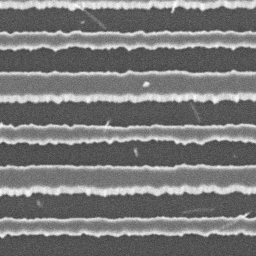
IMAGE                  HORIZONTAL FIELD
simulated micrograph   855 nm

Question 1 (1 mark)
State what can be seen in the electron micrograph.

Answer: lines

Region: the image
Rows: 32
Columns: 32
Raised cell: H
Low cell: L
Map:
HHHHHHHHHHHHHHHHHHHHHHHHHHHHHHHH
LLLLLLLLLLLLLLLLLLLLLLLLLLLLLLLL
LLLLLLLLLLLLLLLLLLLLLLLLLLLLLLLL
LLLLLLLLLLLLLLLLLLLLLLLLLLLLLLLL
HHHHHHHHHHHHHHHHHHHHHHHHHHHHHHHH
HHHHHHHHHHHHHHHHHHHHHHHHHHHHHHHH
LLLLLLLLLLLLLLLLLLLLLLLLLLLLLLLL
LLLLLLLLLLLLLLLLLLLLLLLLLLLLLLLL
LLLLLLLLLLLLLLLLLLLLLLLLLLLLLLLL
HHHHHHHHHHHHHHHHHHHHHHHHHHHHHHHH
HHHHHHHHHHHHHHHHHHHHHHHHHHHHHHHH
HHHHHHHHHHHHHHHHHHHHHHHHHHHHHHHH
LLHLLLLHLLLLLLLLLLLLLLLLLLLLLLLL
LLLLLLLLLLLLLLLLLLLLLLLLLLLLLLLL
LLLLLLLLLLLLLLLLLLLLLLLLLLLLLLLL
LLLLLLLLLLLLLLLLLLLLLLLLLLLLLLLL
HHHHHHHHHHHHHHHHHHHHHHHHHHHHHHHH
HHHHHHHHHHHHHHHHLHHLHHHHHHLHLHHH
LLLLLLLLLLLLLLLLLLLLLLLLLLLLLLLL
LLLLLLLLLLLLLLLLLLLLLLLLLLLLLLLL
LLLLLLLLLLLLLLLLLLLLLLLLLLLLLLLL
HHHHHHHHHHHHHHHHHHHHHHHHHHHHHHHH
HHHHHHHHHHHHHHHHHHHHHHHHHHHHHHHH
HHHHHHHHHHHHHHHHHHHHHHHHHHHHHHHH
LLLLLLLLLLLLLLLLLLLLLLLLLLLLLLLL
LLLLLLLLLLLLLLLLLLLLLLLLLLLLLLLL
LLLLLLLLLLLLLLLLLLLLLLLLLLLLLLLL
HHHHHHHHHHHHHHHHHHHHHHHHHHHHHHHH
HHHHHHHHHHHHHHHHHHHHHHHHHHHHHHHH
HLLLLLLLLLLLLLLLLLLLLLLLLLLLLLLL
LLLLLLLLLLLLLLLLLLLLLLLLLLLLLLLL
LLLLLLLLLLLLLLLLLLLLLLLLLLLLLLLL